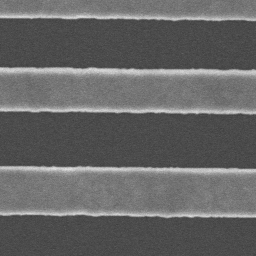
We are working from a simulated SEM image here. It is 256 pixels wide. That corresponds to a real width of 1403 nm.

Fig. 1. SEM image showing lines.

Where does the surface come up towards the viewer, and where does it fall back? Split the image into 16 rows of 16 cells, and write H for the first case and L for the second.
HHHHHHHHHHHHHHHH
LLLLLLLLLLLLLLLL
LLLLLLLLLLLLLLLL
LLLLLLLLLLLLLLLL
HHHHHHHHHHHHHHHH
HHHHHHHHHHHHHHHH
HHHHHHHHHHHHHHHH
LLLLLLLLLLLLLLLL
LLLLLLLLLLLLLLLL
LLLLLLLLLLLLLLLL
HHHHHHHHHLLLLLLL
HHHHHHHHHHHHHHHH
HHHHHHHHHHHHHHHH
LLLLLLHLHHHHHHHH
LLLLLLLLLLLLLLLL
LLLLLLLLLLLLLLLL